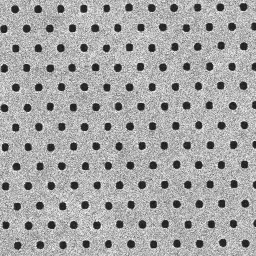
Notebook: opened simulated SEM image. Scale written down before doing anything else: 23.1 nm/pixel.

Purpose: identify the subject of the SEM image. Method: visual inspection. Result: a regular array of holes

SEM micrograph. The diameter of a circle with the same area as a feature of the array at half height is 188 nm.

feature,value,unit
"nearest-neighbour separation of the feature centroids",509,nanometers